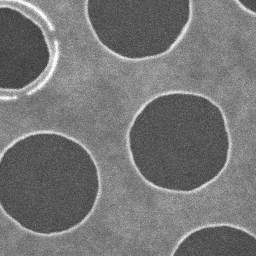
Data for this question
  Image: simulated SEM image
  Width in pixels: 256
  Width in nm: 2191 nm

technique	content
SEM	holes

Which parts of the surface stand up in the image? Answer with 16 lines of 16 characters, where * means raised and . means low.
.****.......***.
..****......****
...***.....*****
...*****..******
...*************
.***************
*********....***
********......**
**..****......**
.....***......**
......***.....**
......****...***
......**********
*....***********
**..********...*
***********.....